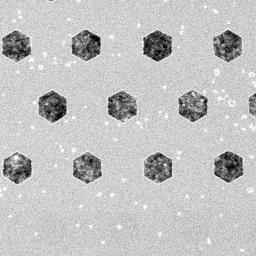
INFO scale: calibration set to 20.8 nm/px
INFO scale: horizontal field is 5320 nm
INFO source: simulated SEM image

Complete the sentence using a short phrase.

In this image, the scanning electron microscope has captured a regular array of holes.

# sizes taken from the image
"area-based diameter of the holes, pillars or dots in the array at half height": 634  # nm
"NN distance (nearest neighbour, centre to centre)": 1450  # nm